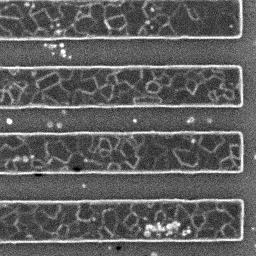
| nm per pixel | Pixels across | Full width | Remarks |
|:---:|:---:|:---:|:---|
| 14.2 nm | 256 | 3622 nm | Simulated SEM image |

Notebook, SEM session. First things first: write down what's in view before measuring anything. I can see wiring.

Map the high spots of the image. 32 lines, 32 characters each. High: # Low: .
##############################..
##############################..
##############################..
##############################..
##############################..
................................
................................
................................
###.##########################..
##############################..
##############################..
##############################..
##############################..
###.............................
................................
................................
..................##..###.####..
##############################..
##############################..
##############################..
##############################..
#####################..##.......
................................
................................
................................
##############################..
##############################..
##############################..
##############################..
##############################..
................................
................................